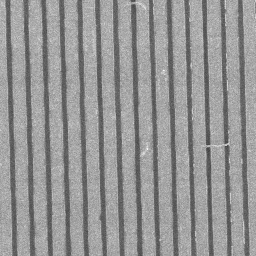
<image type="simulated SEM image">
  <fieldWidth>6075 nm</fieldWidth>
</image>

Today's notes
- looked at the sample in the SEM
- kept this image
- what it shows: parallel lines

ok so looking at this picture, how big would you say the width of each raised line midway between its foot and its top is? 297 nm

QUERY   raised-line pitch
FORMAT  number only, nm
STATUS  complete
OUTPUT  424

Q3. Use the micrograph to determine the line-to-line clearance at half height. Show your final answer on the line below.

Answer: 128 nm